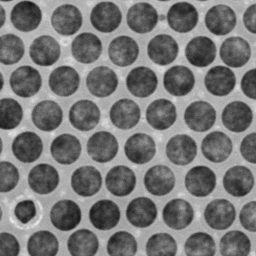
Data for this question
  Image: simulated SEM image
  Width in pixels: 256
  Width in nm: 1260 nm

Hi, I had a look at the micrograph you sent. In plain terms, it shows a regular array of holes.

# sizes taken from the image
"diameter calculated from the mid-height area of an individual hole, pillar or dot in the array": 156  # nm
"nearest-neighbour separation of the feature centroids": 179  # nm